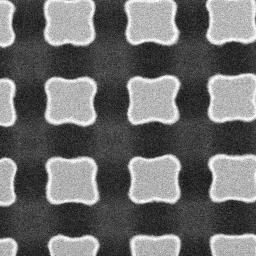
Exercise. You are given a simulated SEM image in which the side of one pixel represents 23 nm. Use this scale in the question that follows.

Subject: raised bodies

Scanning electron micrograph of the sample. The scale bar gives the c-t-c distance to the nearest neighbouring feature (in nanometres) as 1830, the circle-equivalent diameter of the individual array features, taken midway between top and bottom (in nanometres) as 1190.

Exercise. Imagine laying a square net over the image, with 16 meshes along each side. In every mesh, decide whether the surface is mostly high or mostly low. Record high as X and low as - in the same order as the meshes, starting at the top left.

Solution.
X--XXX--XXX--XXX
X--XXX--XXX--XXX
X--XXX--XXX--XXX
----------------
----------------
X--XXX--XXX--XXX
X--XXX--XXX--XXX
X--XXX--XXX--X--
----------------
----------------
X--XXX--XXX--XXX
X--XXX--XXX--XXX
X--XXX--XXX----X
----------------
----------------
X--XXX--XXX--XXX